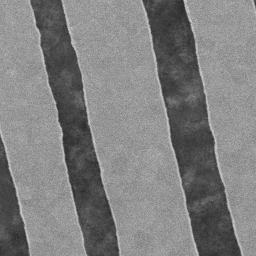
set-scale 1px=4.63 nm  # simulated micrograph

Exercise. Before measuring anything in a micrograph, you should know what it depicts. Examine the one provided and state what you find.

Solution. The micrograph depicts one or a few lines or trenches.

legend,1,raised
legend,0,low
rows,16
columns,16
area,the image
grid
1100111110001111
1100111110001111
1110111110001111
1110011111001111
1110011111000111
1110011111000111
1110011111000111
1111001111000111
1111001111100111
1111001111100111
0111001111100011
0111001111100011
0111100111110011
0111100111110011
0011100111110001
0011100111110001